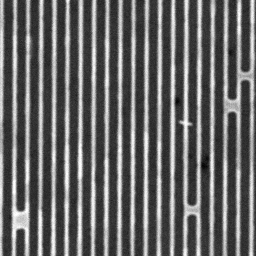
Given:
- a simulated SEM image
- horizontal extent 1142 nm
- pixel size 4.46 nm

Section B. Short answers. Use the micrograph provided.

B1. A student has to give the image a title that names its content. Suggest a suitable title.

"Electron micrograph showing parallel lines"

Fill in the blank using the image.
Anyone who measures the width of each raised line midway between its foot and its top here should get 0.0078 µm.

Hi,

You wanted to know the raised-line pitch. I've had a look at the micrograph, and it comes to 58.8 nm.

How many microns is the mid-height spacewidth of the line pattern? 0.0513